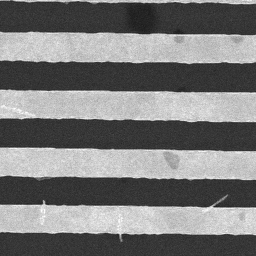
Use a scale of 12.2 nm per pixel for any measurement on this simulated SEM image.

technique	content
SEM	lines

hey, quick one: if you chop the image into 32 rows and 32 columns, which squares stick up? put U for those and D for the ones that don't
DDDDDDDDDDDDDDDDDDDDDDDDDDDDDDDD
DDDDDDDDDDDDDDDDDDDDDDDDDDDDDDDD
DDDDDDDDDDDDDDDDDDDDDDDDDDDDDDDD
DDDDDDDDDDDDDDDDDDDDDDDDDDDDDDDD
UUUUUUUUUUUUUUUUUUUUUUUUUUUUUUUU
UUUUUUUUUUUUUUUUUUUUUUUUUUUUUUUU
UUUUUUUUUUUUUUUUUUUUUUUUUUUUUUUU
DUDUUUUUUUUUUUUUUUUUUUUUUUUUUUUU
DDDDDDDDDDDDDDDDDDDDDDDDDDDDDDDD
DDDDDDDDDDDDDDDDDDDDDDDDDDDDDDDD
DDDDDDDDDDDDDDDDDDDDDDDDDDDDDDDD
UUUUUUUUUUUUUUDDDDDDDDDDDDDDDDDD
UUUUUUUUUUUUUUUUUUUUUUUUUUUUUUUU
UUUUUUUUUUUUUUUUUUUUUUUUUUUUUUUU
UUUUUUUUUUUUUUUUUUUUUUUUUUUUUUUU
DDDDDDDDDDDDDDDDDDDDDDDDDDDDDDDD
DDDDDDDDDDDDDDDDDDDDDDDDDDDDDDDD
DDDDDDDDDDDDDDDDDDDDDDDDDDDDDDDD
DDDDDDDDDDDDDDDDDDDDDDDDDDDDDDDD
UUUUUUUUUUUUUUUUUUUUUUUUUUUUUUUU
UUUUUUUUUUUUUUUUUUUUUUUUUUUUUUUU
UUUUUUUUUUUUUUUUUUUUUUUUUUUUUUUU
DDDDDDDDDDDDDDDDDDDDDDDDDDDDDDDD
DDDDDDDDDDDDDDDDDDDDDDDDDDDDDDDD
DDDDDDDDDDDDDDDDDDDDDDDDDDDDDDDD
DDDDDDDDDDDDDDDDDDDDDDDDDDDDDDDD
UUUUUUUUUUUUUUUUUUUUUUUUUUUUUUUU
UUUUUUUUUUUUUUUUUUUUUUUUUUUUUUUU
UUUUUUUUUUUUUUUUUUUUUUUUUUUUUUUU
DDDDDDDDDDDDDDDDDDDDDDDDDDDDDDDD
DDDDDDDDDDDDDDDDDDDDDDDDDDDDDDDD
DDDDDDDDDDDDDDDDDDDDDDDDDDDDDDDD